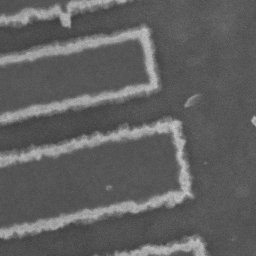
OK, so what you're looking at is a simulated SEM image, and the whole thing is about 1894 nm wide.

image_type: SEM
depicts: one or a few lines or trenches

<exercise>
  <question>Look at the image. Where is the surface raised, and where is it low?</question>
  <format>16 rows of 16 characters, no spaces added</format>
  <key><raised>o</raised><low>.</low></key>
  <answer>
ooooo...........
................
.......oo.......
..ooooooo.......
ooooooooo.......
ooooooooo.......
oooo............
................
.......oooo.....
...oooooooo.....
ooooooooooo.....
oooooooooooo....
oooooooooo......
ooooo...........
o...............
...........o....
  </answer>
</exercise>